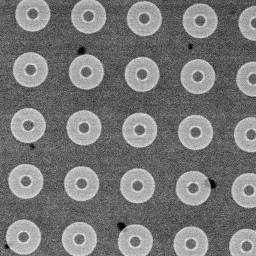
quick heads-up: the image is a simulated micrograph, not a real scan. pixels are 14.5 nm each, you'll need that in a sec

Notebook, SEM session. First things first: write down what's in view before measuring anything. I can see an array of small figures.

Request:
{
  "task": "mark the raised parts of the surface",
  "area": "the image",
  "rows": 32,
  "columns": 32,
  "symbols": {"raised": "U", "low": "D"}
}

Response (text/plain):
DDUUUUDDDDUUUDDDDUUDDDDDDDDDDDDD
DDUUUUDDDUUUUDDDUUUUDDDUUUUDDDUU
DDUUUUDDDUUUUDDDUUUUDDDUUUUDDDUU
DDDUUDDDDDUUUDDDUUUUDDDUUUUDDDUU
DDDDDDDDDDDDDDDDDDDDDDDDUUDDDDDU
DDDDDDDDDDDDDDDDDDDDDDDDDDDDDDDD
DDDDDDDDDDDDDDDDDDDDDDDDDDDDDDDD
DDUUUUDDDUUUDDDDDUUDDDDDUDDDDDDD
DDUUUUDDDUUUUDDDUUUUDDDUUUUDDDUU
DDUUUUDDDUUUUDDDUUUUDDDUUUUDDDUU
DDDUUDDDDUUUDDDDUUUDDDDUUUUDDDUU
DDDDDDDDDDDDDDDDDDDDDDDDUUDDDDUU
DDDDDDDDDDDDDDDDDDDDDDDDDDDDDDDD
DDDDDDDDDDDDDDDDDDDDDDDDDDDDDDDD
DDUUUDDDDUUUDDDDUUUDDDDDUDDDDDDD
DUUUUUDDUUUUUDDUUUUDDDDUUUDDDDUU
DDUUUDDDUUUUUDDUUUUUDDUUUUUDDUUU
DDUUUDDDDUUUDDDDUUUDDDDUUUDDDUUU
DDDDDDDDDDDDDDDDDDDDDDDDUDDDDDUU
DDDDDDDDDDDDDDDDDDDDDDDDDDDDDDDD
DDDDDDDDDDDDDDDDDDDDDDDDDDDDDDDD
DUUUUDDDDUUUDDDDUUDDDDDUUDDDDDDD
DUUUUDDDUUUUDDDUUUUDDDUUUUDDDUUU
DUUUUDDDUUUUDDDUUUUDDDUUUUDDDUUU
DDUUDDDDDUUUDDDDUUUDDDUUUUDDDUUU
DDDDDDDDDDDDDDDDDDDDDDDUUDDDDDUU
DDDDDDDDDDDDDDDDDDDDDDDDDDDDDDDD
DDDDDDDDDDDDDDDDDDDDDDDDDDDDDDDD
DUUUUDDDUUUUDDDDUUDDDDDUUDDDDDDD
DUUUUDDDUUUUDDDUUUUDDDUUUUDDDUUU
DUUUUDDDUUUUDDDUUUUDDDUUUUDDDUUU
DDUUDDDDUUUDDDDUUUUDDDUUUUDDDUUU